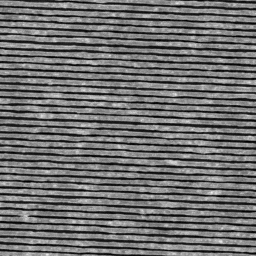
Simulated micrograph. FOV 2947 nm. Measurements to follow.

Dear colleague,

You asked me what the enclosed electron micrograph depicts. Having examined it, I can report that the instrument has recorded parallel lines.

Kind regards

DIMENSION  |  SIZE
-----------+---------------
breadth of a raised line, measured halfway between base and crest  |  0.0489 microns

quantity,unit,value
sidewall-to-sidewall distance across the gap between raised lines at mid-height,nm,30.2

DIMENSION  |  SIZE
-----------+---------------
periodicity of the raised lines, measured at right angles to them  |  80.2 nanometers